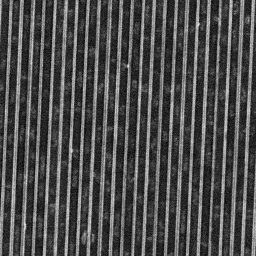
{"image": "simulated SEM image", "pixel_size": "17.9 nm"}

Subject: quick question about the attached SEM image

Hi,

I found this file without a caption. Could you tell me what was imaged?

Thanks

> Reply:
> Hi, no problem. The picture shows parallel lines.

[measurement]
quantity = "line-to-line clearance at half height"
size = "8.62 pixels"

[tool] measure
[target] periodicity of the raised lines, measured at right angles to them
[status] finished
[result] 197 nm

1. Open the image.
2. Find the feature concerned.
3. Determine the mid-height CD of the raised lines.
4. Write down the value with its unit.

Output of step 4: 47 nanometers